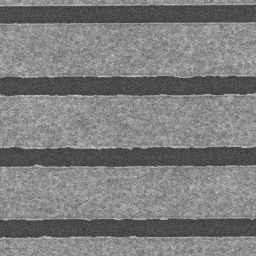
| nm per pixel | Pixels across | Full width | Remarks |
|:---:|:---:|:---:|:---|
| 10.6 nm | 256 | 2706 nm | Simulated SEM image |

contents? one or a few lines or trenches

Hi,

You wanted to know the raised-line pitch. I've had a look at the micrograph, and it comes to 754 nm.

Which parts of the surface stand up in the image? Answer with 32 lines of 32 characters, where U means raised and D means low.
UUUUUUUUUUUUUUUUUUUUUUUUUUDDDDDD
DDDDDDDDDDDDDDDDDDDDDDDDDDDDDDDD
DDDDDDDDDDDDDDDDDDDDDDDDDDDDDDDD
UUUUUUUUUUUUUUUUUUUUUUUUUUUUUUUU
UUUUUUUUUUUUUUUUUUUUUUUUUUUUUUUU
UUUUUUUUUUUUUUUUUUUUUUUUUUUUUUUU
UUUUUUUUUUUUUUUUUUUUUUUUUUUUUUUU
UUUUUUUUUUUUUUUUUUUUUUUUUUUUUUUU
UUUUUUUUUUUUUUUUUUUUUUUUUUUUUUUU
UUUUUUUUUUUDDDDDDDDDDDUUDUDDDDUD
DDDDDDDDDDDDDDDDDDDDDDDDDDDDDDDD
DDDDDDDDDDDDDDDDDDDDDDDDDDDDDDDD
UUUUUUUUUUUUUUUUUUUUUUUUUUUUUUUU
UUUUUUUUUUUUUUUUUUUUUUUUUUUUUUUU
UUUUUUUUUUUUUUUUUUUUUUUUUUUUUUUU
UUUUUUUUUUUUUUUUUUUUUUUUUUUUUUUU
UUUUUUUUUUUUUUUUUUUUUUUUUUUUUUUU
UUUUUUUUUUUUUUUUUUUUUUUUUUUUUUUU
DDDDDDDDDDDDDDDDUDDDDDDDDDDDDDDD
DDDDDDDDDDDDDDDDDDDDDDDDDDDDDDDD
DDDDDDDDDDDDDDDDDDDDDDDDDDDDDDDD
UUUUUUUUUUUUUUUUUUUUUUUUUUUUUUUU
UUUUUUUUUUUUUUUUUUUUUUUUUUUUUUUU
UUUUUUUUUUUUUUUUUUUUUUUUUUUUUUUU
UUUUUUUUUUUUUUUUUUUUUUUUUUUUUUUU
UUUUUUUUUUUUUUUUUUUUUUUUUUUUUUUU
UUUUUUUUUUUUUUUUUUUUUUUUUUUUUUUU
DDDDDDDDDDDDDDDDDDDDDDDDDDDDDDDD
DDDDDDDDDDDDDDDDDDDDDDDDDDDDDDDD
DDDDDDDDDDDDDDDDDDDDDDDDDDDDDDDD
UUUUUUUUUUUUUUUUUUUUUUUUUUUUUUUU
UUUUUUUUUUUUUUUUUUUUUUUUUUUUUUUU